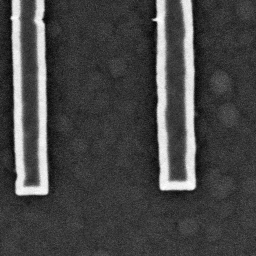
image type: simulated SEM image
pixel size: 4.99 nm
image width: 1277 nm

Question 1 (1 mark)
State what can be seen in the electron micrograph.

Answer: one or a few lines or trenches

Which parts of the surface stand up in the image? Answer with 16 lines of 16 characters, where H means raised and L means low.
LHHLLLLLLLHHLLLL
LHHLLLLLLLHHLLLL
LHHLLLLLLLHHLLLL
LHHLLLLLLLHHLLLL
LHHLLLLLLLHHLLLL
LHHLLLLLLLHHLLLL
LHHLLLLLLLHHLLLL
LHHLLLLLLLHHLLLL
LHHLLLLLLLHHLLLL
LHHLLLLLLLHHLLLL
LHHLLLLLLLHHLLLL
LHHLLLLLLLHHLLLL
LLLLLLLLLLLLLLLL
LLLLLLLLLLLLLLLL
LLLLLLLLLLLLLLLL
LLLLLLLLLLLLLLLL